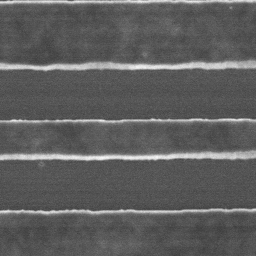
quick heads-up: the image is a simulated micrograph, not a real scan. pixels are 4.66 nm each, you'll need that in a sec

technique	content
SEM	lines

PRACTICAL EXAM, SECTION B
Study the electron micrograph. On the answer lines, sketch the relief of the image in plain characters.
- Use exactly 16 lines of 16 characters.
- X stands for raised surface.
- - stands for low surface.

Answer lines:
XXXXXXXXXXXXXXXX
XXXXXXXXXXXXXXXX
XXXXXXXXXXXXXXXX
XXXXXXXXXXXXXXXX
----------------
----------------
----------------
---------XXXXXXX
XXXXXXXXXXXXXXXX
XXXXXXXXXXXXXXXX
----------------
----------------
----------------
XXXXXXXXXXXXXXXX
XXXXXXXXXXXXXXXX
XXXXXXXXXXXXXXXX